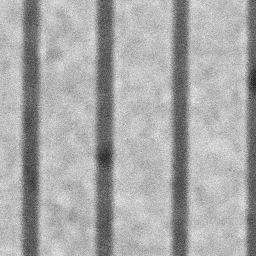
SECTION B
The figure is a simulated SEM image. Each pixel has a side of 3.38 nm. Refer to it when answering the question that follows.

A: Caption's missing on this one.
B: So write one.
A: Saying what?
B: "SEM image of one or a few lines or trenches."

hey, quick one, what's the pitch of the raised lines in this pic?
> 254 nm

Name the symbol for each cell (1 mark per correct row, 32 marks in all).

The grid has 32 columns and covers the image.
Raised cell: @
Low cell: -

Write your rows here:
@@@--@@@@@@@--@@@@@@@---@@@@@@@-
@@@--@@@@@@@--@@@@@@@---@@@@@@@-
@@@--@@@@@@@--@@@@@@@---@@@@@@@-
@@@--@@@@@@@--@@@@@@@---@@@@@@@-
@@@--@@@@@@@--@@@@@@@---@@@@@@@-
@@@--@@@@@@@--@@@@@@@---@@@@@@@-
@@@--@@@@@@@--@@@@@@@---@@@@@@@-
@@@--@@@@@@@--@@@@@@@---@@@@@@@-
@@@--@@@@@@@--@@@@@@@---@@@@@@@-
@@@--@@@@@@@--@@@@@@@---@@@@@@@-
@@@--@@@@@@@--@@@@@@@---@@@@@@@-
@@@--@@@@@@@--@@@@@@@---@@@@@@@-
@@@--@@@@@@@--@@@@@@@---@@@@@@@-
@@@--@@@@@@@--@@@@@@@---@@@@@@@-
@@@--@@@@@@@--@@@@@@@---@@@@@@@-
@@@--@@@@@@@--@@@@@@@---@@@@@@@-
@@@--@@@@@@@--@@@@@@@---@@@@@@@-
@@@--@@@@@@@--@@@@@@@---@@@@@@@-
@@@--@@@@@@@--@@@@@@@---@@@@@@@-
@@@--@@@@@@@--@@@@@@@---@@@@@@@-
@@@--@@@@@@@--@@@@@@@---@@@@@@@-
@@@--@@@@@@@--@@@@@@@---@@@@@@@-
@@@--@@@@@@@--@@@@@@@---@@@@@@@-
@@@--@@@@@@@--@@@@@@@---@@@@@@@-
@@@--@@@@@@@--@@@@@@@---@@@@@@@-
@@@--@@@@@@@--@@@@@@@---@@@@@@@-
@@@--@@@@@@@--@@@@@@@---@@@@@@@-
@@@--@@@@@@@--@@@@@@@---@@@@@@@-
@@@--@@@@@@@--@@@@@@@---@@@@@@@-
@@@--@@@@@@@--@@@@@@@---@@@@@@@-
@@@--@@@@@@@--@@@@@@@---@@@@@@@-
@@@--@@@@@@@--@@@@@@@---@@@@@@@-